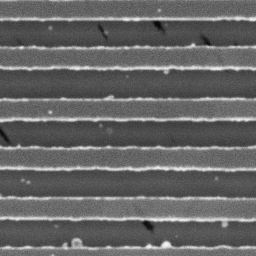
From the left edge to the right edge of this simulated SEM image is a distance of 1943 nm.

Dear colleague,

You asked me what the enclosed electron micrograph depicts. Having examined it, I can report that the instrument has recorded lines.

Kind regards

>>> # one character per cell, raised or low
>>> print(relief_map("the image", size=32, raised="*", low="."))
********************************
********************************
.....*..*.......................
................................
................................
................................
********************************
********************************
*******.************************
................................
................................
................................
********************************
********************************
********************************
................................
................................
................................
********.***********************
********************************
********************************
................................
................................
................................
................................
********************************
********************************
........................**....**
................................
................................
................................
********************************